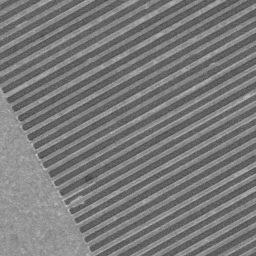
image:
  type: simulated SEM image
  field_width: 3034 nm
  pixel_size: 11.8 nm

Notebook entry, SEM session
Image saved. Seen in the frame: parallel lines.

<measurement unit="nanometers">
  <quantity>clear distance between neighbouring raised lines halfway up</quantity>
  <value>76.4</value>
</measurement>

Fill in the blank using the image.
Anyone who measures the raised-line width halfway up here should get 44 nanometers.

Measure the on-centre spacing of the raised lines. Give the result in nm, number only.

126